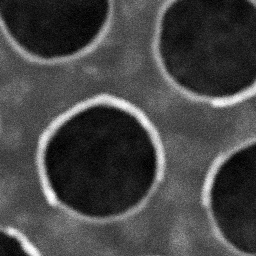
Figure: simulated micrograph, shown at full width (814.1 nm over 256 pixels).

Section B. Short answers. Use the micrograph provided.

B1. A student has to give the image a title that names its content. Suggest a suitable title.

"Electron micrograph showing holes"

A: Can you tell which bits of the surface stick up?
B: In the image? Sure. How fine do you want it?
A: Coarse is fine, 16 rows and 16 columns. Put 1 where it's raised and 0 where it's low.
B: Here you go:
0000000111000000
0000000111000000
1000001111000000
1100111111000000
1111111111000000
1111111111100000
1111111111111111
1111000001111111
1110000001111111
1110000000111110
1110000000111100
1110000000111000
1111000001111000
1111100111111000
1111111111111100
0111111111111110